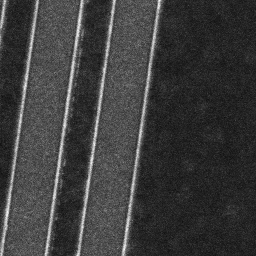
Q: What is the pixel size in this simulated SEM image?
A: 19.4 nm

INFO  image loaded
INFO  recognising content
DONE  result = one or a few lines or trenches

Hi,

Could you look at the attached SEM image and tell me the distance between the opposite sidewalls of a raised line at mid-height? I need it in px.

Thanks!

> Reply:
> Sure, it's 32.1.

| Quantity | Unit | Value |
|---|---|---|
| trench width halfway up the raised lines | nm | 857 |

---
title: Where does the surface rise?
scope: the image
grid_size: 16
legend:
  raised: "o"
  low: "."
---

oo...oo...oooooo
oo...oo...oooooo
oo...oo...oooooo
oo...oo..ooooooo
oo..oo...ooooooo
oo..oo...ooooooo
o...oo...ooooooo
o...oo...ooooooo
o...oo...ooooooo
o...oo...ooooooo
o...oo..oooooooo
o..ooo..oooooooo
o..oo...oooooooo
...oo...oooooooo
...oo...oooooooo
...oo...oooooooo